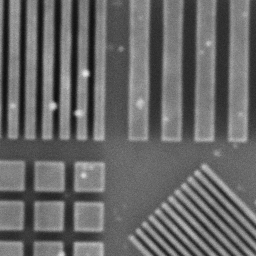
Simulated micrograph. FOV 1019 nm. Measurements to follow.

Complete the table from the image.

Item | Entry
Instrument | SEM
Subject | groups of lines, slits or small figures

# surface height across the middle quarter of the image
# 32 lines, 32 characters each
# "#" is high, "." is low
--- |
#...##..##.......####....####...
#...##..##.......####....####...
#...##..##.......####....####...
#...##..##......#####....####...
#...##..##......#####....####...
#..###..##......#####....####...
#..###..##......#####....####...
#..###..##......#####....####...
#..###..##......#####....####...
#..###..##......#####....####...
#..###..##......#####....####...
#..###..##......#####....####...
#..##...##......#####....####...
#..##...##......#####....####...
#..##...##......#####....####...
#..##...##......#####....####...
#..##...##......#####....####...
#..##...##......#####....####...
#..##...##......#####....####...
................................
................................
................................
................................
................................
................................
...#######......................
...#######......................
...#######......................
...#######.....................#
...#######.....................#
...#######....................#.
...#######....................##